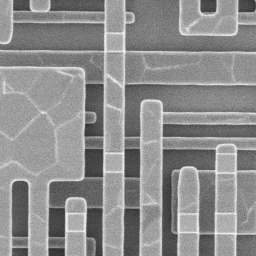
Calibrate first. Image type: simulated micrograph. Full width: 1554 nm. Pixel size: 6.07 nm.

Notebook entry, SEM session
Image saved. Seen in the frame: wiring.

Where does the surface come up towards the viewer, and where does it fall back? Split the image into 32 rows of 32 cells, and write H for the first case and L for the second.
HHLLHHLLLLLLLHHHLLLLLLHHHLLHHHLL
HHLLLLLLLLLLLHHHLLLLLLHHHLLHHHLL
HHLLLLLLLLLLLHHHLLLLLLHHHHHHHHLL
HHLLLLLLLLLLLHHHLLLLLLHHHHHHHHLL
HLLLLLLLLLLLLHHHLLLLLLLLLLLLLLLL
LLLLLLLLLLLLLHHHLLLLLLLLLLLLLLLL
LLLLLLLLLLLLLHHHLLLLLLLLLLLLLLLL
LLLLLLLLLLLLLHHHLLLLLLLLLLLLLLLL
HHHHHHHLHHLLLHHHLLLLLLLLLLLLLLLL
HHHHHHHHHHHLLHHHLLLLLLLLLLLLLLLL
HHHHHHHHHHHLLHHHLLLLLLLLLLLLLLLL
HHHHHHHHHHHLLHHHLLLLLLLLLLLLLLLL
HHHHHHHHHHHLLHHHLLLLLLLLLLLLLLLL
HHHHHHHHHHLLLHHHLLHHLLLLLLLLLLLL
HHHHHHHHHHHLLHHHLLHHLLLLLLLLLLLL
HHHHHHHHHHLLLHHHLLHHLLLLLLLLLLLL
HHHHHHHHHHLLLHHLLLHHLLLLLLLLLLLL
HHHHHHHHHHLLLHHHLLHHLLLLLLLLLLLL
HHHHHHHHHHLLLHHHLLHHLLLLLLLHHLLL
HHHHHHHHHHLLLHHHLLHHLLLLLLLHHHLL
HHHHHHHHHHLLLHHHLLHHLLLLLLLHHHLL
HHHHHHHHHHLLLHHLLLHHLLLHHLLHHHLL
HHLHHHHHHHLLLHHLLLHHLLHHHLLHHHLL
HLLLHHLLLLLLLHHLLLHHLLHHHLLHHHLL
HLLLHHLLLLLLLHHLLLHHLLHHHLLHHHLL
HLLLHHLLHHHLLHHHLLHHLLHHHLLHHHLL
HLLLHHLLHHHLLHHLLLHHLLHHHLLHHHLL
HLLLHHLLHHHLLHHLLLHHLLHHHLLHHHLL
HLLLHHLLHHHLLHHLLLHHLLHHHLLHHHLL
HLLLHHLLHHHLLHHLLLHHLLHHHLLHHHLL
HLLLHHLLHHHLLHHLLLHHLLHHHLLHHLLL
HLLLHHLLHHHLLHHLLLHHLLHHHLLHHHLL